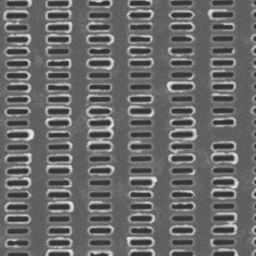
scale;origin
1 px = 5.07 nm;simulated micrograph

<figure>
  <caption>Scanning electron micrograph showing a regular array of holes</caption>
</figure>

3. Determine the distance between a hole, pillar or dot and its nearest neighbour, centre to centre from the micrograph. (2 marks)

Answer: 60.5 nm